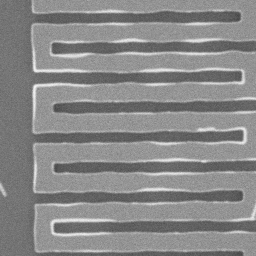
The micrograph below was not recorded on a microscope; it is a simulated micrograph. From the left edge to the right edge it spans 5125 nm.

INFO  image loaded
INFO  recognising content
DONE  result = groups of lines, slits or small figures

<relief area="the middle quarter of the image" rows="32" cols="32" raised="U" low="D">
UUUUUUUUUUUUUUUUUUUUUUUUUUUUUUUU
UUUUUUUUUUUUUUUUUUUUUUUUUUUUUUUU
DDDDDDDDDDDDDDDDDDDDDDDDDDDDDDDD
DDDDDDDDDDDDDDDDDDDDDDDDDDDDDDDD
DDDDDDDDDDDDDDDDDDDDDDDDDDDDDDDD
UUUUUUUUUUUUUUUUUUUUUUUUUUUUUUUU
UUUUUUUUUUUUUUUUUUUUUUUUUUUUUUUU
UUUUUUUUUUUUUUUUUUUUUUUUUUUUUUUU
UUUUUUUUUUUUUUUUUUUUUUUUUUUUUUUU
UDDDDDDDDDDDDDDDDDDDDDDDDDDDDDDD
DDDDDDDDDDDDDDDDDDDDDDDDDDDDDDDD
DDDDDDDDDDDDDDDDDDDDDDDDDDDDDDDD
UDDDDDUUUUUUUUUUUUUUUUUUUUUUUUUU
UUUUUUUUUUUUUUUUUUUUUUUUUUUUUUUU
UUUUUUUUUUUUUUUUUUUUUUUUUUUUUUUU
UUUUUUUUUUUUUUUUUUUUUUUUUUUUUUUU
UUUUUUUUUUUUUUUUUUUUUUUUUUUUUUUU
DDDDDDDDDDDDDDDDDDDDDDDDDDDDDDDD
DDDDDDDDDDDDDDDDDDDDDDDDDDDDDDDD
DDDDDDDDDDDDDDDDDDDDUUDDDDDDDDDD
UUUUUUUUUUUUUUUUUUUUUUUUUUUUUUUU
UUUUUUUUUUUUUUUUUUUUUUUUUUUUUUUU
UUUUUUUUUUUUUUUUUUUUUUUUUUUUUUUU
UUUUUUUUUUUUUUUUUUUUUUUUUUUUUUUU
UDDDDDDDDDDDDDDDDDDDDDDDDDDDDDDD
DDDDDDDDDDDDDDDDDDDDDDDDDDDDDDDD
DDDDDDDDDDDDDDDDDDDDDDDDDDDDDDDD
UUUDDDDUUUUUUUUUUUUUUDDDUUUUUUUU
UUUUUUUUUUUUUUUUUUUUUUUUUUUUUUUU
UUUUUUUUUUUUUUUUUUUUUUUUUUUUUUUU
UUUUUUUUUUUUUUUUUUUUUUUUUUUUUUUU
UUUUUUUUUUUUUUUUUUUDDDDDDDDDDDUU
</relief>